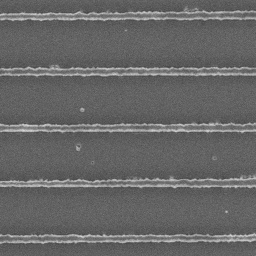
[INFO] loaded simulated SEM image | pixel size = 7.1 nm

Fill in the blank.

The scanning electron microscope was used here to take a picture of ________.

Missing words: lines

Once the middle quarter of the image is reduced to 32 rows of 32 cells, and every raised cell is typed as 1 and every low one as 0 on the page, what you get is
00000000000000000000000000000000
11111111111111111111111111111111
11111111111111111111111011111111
00000000000000000000000000000000
00000000000000000000000000000000
00000000000000000000000000000000
00000000000000000000000000000000
00000000000000000000000000000000
00000000000000000000000000000000
00000000000000000000000000000000
00000000000000000000000000000000
00000000000000000000000000000000
00000000000000000000000000000000
00000000000000000000000000000000
00000000000000000000000000000000
11111111111111111111111111111111
11111111111111111111111111111111
00000000000000000000000000000000
00000000000000000000000000000000
00000000000000000000000000000000
00000000000000000000000000000000
00000000000000000000000000000000
00000000000000000000000000000000
00000000000000000000000000000000
00000000000000000000000000000000
00000000000000000000000000000000
00000000000000000000000000000000
00000000000000000000000000000000
00000000000000000000000000000000
11111111111111111111111111111111
11111111111111111111111111111111
00000000000000000000000000000000